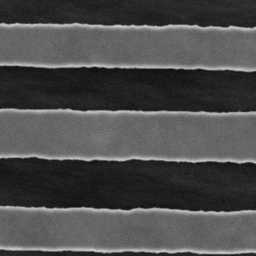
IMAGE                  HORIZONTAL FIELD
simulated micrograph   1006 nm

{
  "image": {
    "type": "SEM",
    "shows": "lines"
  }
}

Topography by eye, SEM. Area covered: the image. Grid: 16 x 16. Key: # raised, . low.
................
.#..#...........
################
################
................
................
................
################
################
################
................
................
................
################
################
################